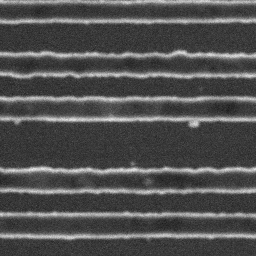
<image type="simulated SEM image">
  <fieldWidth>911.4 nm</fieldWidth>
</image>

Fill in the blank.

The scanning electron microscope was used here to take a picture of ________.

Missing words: lines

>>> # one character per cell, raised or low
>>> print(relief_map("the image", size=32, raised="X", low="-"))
XXXXXXXXXXXXXXXXXXXXXXXXXXXXXXXX
XXXXXXXXXXXXXXXXXXXXXXXXXXXXXXXX
XXXXXXXXXXXXXXXXXXXXXXXXXXXXXXXX
--------------------------------
--------------------------------
--------------------------------
----------------------X---------
XXXXXXXXXXXXXXXXXXXXXXXXXXXXXXXX
XXXXXXXXXXXXXXXXXXXXXXXXXXXXXXXX
--XX-----X-------X---XXXXXXXXXXX
--------------------------------
--------------------------------
XXXXXXXXXXXXXXXXXXXXXXXXXXXXXXXX
XXXXXXXXXXXXXXXXXXXXXXXXXXXXXXXX
XXXXXXXXXXXXXXXXXXXXXXXXXXXXXXXX
--------------------------------
--------------------------------
--------------------------------
--------------------------------
--------------------------------
--------------------------------
XXXXXXXXXXXXXXXXXXXXXXXXXXXXXXXX
XXXXXXXXXXXXXXXXXXXXXXXXXXXXXXXX
XXXXXXXXXXXXXXXXXXXXXXXXXXXXXXXX
--------------------------------
--------------------------------
--------------------------------
XXXXXXXXXXXXXXXXXXXXXXXXXXXXXXXX
XXXXXXXXXXXXXXXXXXXXXXXXXXXXXXXX
XXXXXXXXXXXXXXXXXXXXXXXXXXXXXXXX
--------------------------------
--------------------------------